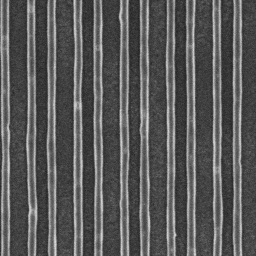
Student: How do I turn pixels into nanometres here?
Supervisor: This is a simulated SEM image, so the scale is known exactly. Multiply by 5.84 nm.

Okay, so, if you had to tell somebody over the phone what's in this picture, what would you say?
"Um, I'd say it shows parallel lines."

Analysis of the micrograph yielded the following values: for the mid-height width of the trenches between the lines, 93.4 nm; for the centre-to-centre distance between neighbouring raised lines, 23.2 pixels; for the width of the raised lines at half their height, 40.9 nm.